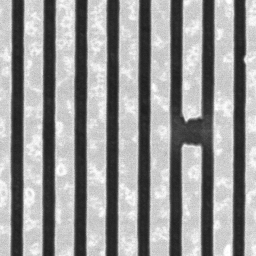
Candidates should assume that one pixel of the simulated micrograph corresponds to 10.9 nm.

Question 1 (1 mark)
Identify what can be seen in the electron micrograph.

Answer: parallel lines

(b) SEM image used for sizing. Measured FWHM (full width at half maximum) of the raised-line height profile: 230 nanometers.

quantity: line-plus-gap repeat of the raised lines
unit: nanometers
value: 345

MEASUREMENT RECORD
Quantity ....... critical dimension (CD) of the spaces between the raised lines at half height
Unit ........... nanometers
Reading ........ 120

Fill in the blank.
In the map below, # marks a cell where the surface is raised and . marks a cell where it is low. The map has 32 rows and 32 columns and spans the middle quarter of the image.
###...#####...#####...#####..###
###...#####...#####...#####..###
###...#####...#####...#####..###
###...#####...#####...#####..###
###...#####...#####...#####..###
###...#####...#####...#####..###
###...#####...#####...#####..###
###...#####...#####...#####..###
###...#####...#####...#####..###
###...#####...#####...####...###
###...#####...#####...####...###
###...#####...#####...####...###
###...#####...#####...####...###
###...#####...#####...####....##
###...#####...#####...####......
###...#####...#####...#####.....
###...#####...#####...#####.....
###...#####...#####...#####.....
###...#####...#####...#####.....
###...#####...#####..#####......
###...#####...#####...#####...##
###...#####...#####..#####...###
###...#####..######...####...###
###...#####..######...####...###
###...#####..######...#####..###
###...#####..######...#####..###
###...#####..######...#####..###
###...#####..######...#####..###
###...#####..######...#####..###
###...#####..######...####...###
###...#####..######...#####..###
###...#####..######...####...###